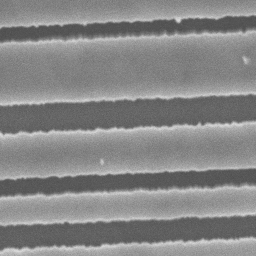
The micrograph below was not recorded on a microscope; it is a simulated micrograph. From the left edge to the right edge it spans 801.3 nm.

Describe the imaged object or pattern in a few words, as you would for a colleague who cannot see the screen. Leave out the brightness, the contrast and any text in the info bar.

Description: lines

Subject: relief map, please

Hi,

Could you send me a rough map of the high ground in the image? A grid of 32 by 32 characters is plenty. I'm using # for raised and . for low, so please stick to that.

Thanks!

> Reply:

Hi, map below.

################################
################################
###################...#.........
................................
..................##############
################################
################################
################################
################################
################################
################################
################################
############....................
................................
................................
.............................###
......##########################
################################
################################
################################
################################
####################............
................................
...........................#####
....############################
################################
################################
################................
................................
................................
...............#################
################################